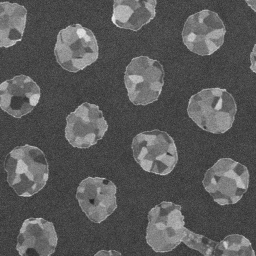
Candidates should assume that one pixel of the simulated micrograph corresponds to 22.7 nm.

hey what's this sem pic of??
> a regular array of raised bodies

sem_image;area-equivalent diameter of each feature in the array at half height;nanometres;1000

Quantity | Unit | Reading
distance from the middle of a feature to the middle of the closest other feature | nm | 1660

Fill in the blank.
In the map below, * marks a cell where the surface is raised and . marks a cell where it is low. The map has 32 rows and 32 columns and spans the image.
**............*****............*
***...........*****......*......
***...........*****....*****....
***.....***....**......*****....
***....*****...........*****....
**.....*****...........*****....
.......*****............***.....
.......*****.....**............*
........**......****............
..*.............****............
****............****............
*****...........****.....***....
*****...........***.....*****...
****......**............*****...
..*......****...........*****...
........*****............****...
........*****.....**......**....
........****.....*****..........
..***............*****..........
.*****...........*****..........
.*****...........*****.....***..
.*****.............**.....*****.
.*****.....**............******.
..***.....****............*****.
..........****.............***..
..........*****.....**..........
...........***.....****.........
...***.....**......****.........
...****...........*****.........
..*****...........*******....*..
..*****............***.********.
..*****.....***..........*******